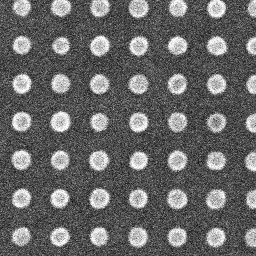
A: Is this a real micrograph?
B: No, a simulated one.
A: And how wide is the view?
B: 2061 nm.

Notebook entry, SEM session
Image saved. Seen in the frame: a regular array of raised bodies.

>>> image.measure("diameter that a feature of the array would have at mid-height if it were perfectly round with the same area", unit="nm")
140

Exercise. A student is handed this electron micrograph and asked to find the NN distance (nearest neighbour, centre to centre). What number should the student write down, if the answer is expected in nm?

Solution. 307